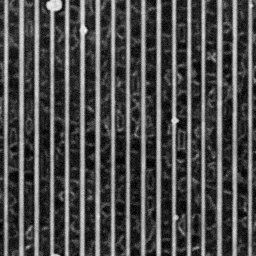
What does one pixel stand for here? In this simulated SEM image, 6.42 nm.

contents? parallel lines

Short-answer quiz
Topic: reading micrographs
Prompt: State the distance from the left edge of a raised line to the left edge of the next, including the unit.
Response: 97.9 nanometres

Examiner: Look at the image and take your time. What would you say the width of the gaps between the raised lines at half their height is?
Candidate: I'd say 77.1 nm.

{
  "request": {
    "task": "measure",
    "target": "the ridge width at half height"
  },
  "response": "0.0193 µm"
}